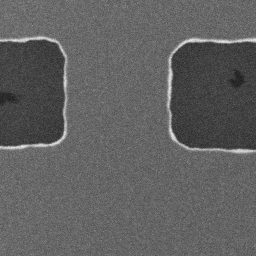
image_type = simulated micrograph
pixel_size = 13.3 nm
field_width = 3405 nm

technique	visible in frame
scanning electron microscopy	holes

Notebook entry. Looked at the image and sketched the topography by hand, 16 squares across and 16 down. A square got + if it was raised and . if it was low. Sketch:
++++++++++++++++
++++++++++++++++
++.+++++++++++++
....+++++++.....
....+++++++.....
....+++++++.....
....+++++++.....
....+++++++.....
....+++++++.....
++++++++++++++++
++++++++++++++++
++++++++++++++++
++++++++++++++++
++++++++++++++++
++++++++++++++++
++++++++++++++++